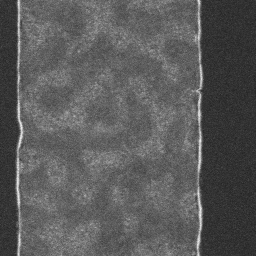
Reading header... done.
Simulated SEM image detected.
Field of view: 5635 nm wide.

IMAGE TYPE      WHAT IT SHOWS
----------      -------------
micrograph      one or a few lines or trenches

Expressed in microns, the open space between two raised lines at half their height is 3.97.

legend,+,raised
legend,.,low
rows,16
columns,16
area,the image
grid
+...........++++
+...........++++
+...........++++
+...........++++
+............+++
+...........++++
+...........++++
+...........++++
+...........++++
+...........++++
+...........++++
+...........++++
+...........++++
+............+++
+...........++++
+...........++++